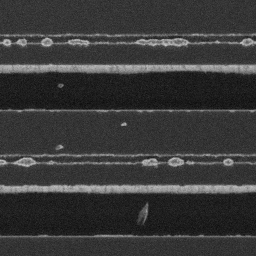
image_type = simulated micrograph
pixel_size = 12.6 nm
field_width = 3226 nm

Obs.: lines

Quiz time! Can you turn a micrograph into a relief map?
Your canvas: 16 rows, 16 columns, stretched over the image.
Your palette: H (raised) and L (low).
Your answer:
HHHHHHHHHHHHHHHH
HHHHHHHHHHHHHHHH
HHHHHHHHHHHHHHHH
HHHHHHHHHHHHHHHH
LLLLLLLLLLLLLLLL
LLLLLLLLLLLLLLLL
LLLLLLLLLLLLLLLL
HHHHHHHHHHHHHHHH
HHHHHHHHHHHHHHHH
HHHHHHHHHHHHHHHH
HHHHHHHHHHHHHHHH
HHHHHHHHHHHHHHHH
LLLLLLLLLLLLLLLL
LLLLLLLLLLLLLLLL
LLLLLLLLLLLLLLLL
HHHHHHHHHHHHHHHH